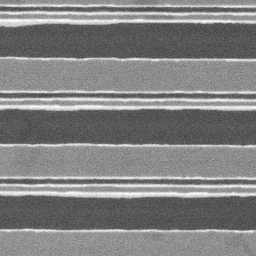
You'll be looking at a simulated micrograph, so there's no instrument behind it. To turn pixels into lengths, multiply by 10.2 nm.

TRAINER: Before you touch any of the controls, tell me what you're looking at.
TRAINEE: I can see lines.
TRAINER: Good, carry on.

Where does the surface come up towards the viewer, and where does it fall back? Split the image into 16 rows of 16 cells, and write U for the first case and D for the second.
UUUUUUUUUUUUUUUU
DDDDDDDDDDDDDDDD
DDDDDDDDDDDDDDDD
DDDDDDDDDDDDDDDD
UUUUUUUUUUUUUUUU
UUUUUUUUUUUUUUUU
UUUUUUUUUUUUUUUU
DDDDDDDDDDDDDDDD
DDDDDDDDDDDDDDDD
UUUUUUUUUUUUUUUU
UUUUUUUUUUUUUUUU
UUUUUUUUUUUUUUUU
DDDDDDDDDDDDDDDD
DDDDDDDDDDDDDDDD
UUUUUUUUUUUUUUUU
UUUUUUUUUUUUUUUU